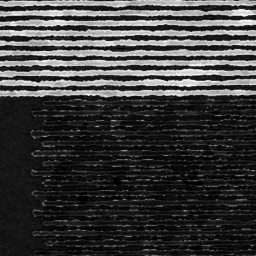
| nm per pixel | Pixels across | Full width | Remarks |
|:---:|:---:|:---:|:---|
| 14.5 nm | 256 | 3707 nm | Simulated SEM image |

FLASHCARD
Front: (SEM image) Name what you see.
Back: parallel lines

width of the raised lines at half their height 0.0634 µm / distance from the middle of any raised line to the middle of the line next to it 145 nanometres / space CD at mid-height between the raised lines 77.9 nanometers